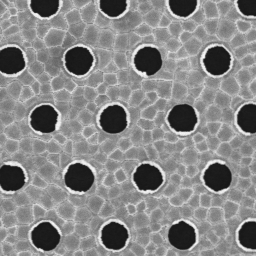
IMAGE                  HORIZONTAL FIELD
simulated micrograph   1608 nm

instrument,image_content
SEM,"a regular array of holes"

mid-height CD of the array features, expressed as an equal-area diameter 175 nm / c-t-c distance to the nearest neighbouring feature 423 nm